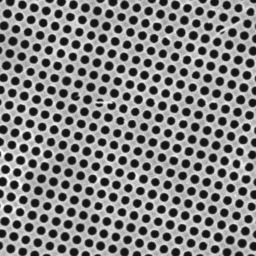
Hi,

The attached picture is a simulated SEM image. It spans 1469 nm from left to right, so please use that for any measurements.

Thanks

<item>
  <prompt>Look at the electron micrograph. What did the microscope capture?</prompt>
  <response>a regular array of holes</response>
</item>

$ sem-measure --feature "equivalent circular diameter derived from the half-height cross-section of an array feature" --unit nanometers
49.3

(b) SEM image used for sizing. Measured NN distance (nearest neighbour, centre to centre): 70.3 nm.